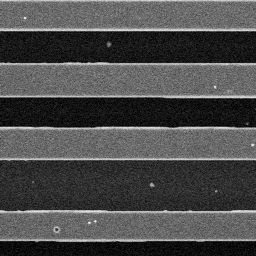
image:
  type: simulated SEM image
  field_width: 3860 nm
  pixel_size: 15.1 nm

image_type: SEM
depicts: lines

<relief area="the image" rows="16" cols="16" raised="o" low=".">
oooooooooooooooo
oooooooooooooooo
................
................
oooooooooooooooo
oooooooooooooooo
................
................
oooooooooooooooo
oooooooooooooooo
................
................
................
oooooooooooooooo
oooooooooooooooo
................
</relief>